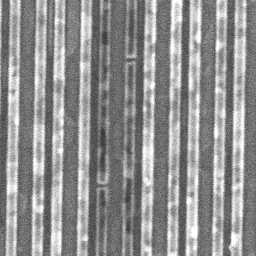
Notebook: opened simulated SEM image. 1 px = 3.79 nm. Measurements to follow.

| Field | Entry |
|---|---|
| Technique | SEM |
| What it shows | parallel lines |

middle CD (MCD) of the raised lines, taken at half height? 31.3 nm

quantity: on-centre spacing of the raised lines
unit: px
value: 22.6